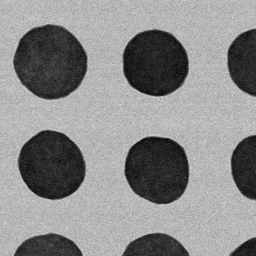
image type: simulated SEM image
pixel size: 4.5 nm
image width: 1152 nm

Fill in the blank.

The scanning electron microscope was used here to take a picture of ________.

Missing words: holes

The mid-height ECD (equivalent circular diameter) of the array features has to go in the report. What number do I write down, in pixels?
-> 67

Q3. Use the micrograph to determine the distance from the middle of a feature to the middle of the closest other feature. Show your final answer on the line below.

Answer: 469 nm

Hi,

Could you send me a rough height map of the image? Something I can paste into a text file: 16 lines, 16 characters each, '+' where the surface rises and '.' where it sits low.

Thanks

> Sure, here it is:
++++++++++++++++
++++++++++++++++
+....+++...++++.
+....+++....++..
+....+++....++..
++...+++...++++.
++++++++++++++++
++++++++++++++++
++..++++++++++++
+....+++....+++.
+....+++....++..
++...+++....+++.
+++++++++..+++++
++++++++++++++++
++++++++++++++++
+....+++....+++.